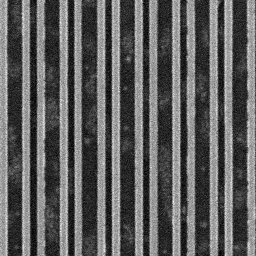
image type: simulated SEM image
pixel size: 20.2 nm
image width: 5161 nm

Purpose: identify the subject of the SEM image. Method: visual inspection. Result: parallel lines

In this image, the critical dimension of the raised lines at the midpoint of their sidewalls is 136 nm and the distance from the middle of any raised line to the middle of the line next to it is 18.8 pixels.